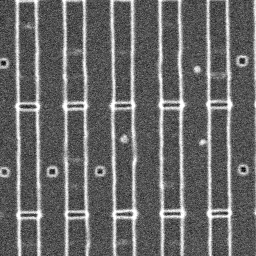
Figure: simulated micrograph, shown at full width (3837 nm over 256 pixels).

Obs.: wiring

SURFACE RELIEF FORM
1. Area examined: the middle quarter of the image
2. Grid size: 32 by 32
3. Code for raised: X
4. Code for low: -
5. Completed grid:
-----XXXXXXX-----XXXXXXX-----XXX
-----XXXXXXX-----XXXXXXX-----XXX
-----XXXXXXX-----XXXXXXX-----XXX
-----XXXXXXXX----XXXXXXX-----XXX
-----XXXXXXXX----XXXXXXX-----XXX
-----XXXXXXXX----XXXXXXX-----XXX
-----XXXXXXXX----XXXXXXX-----XXX
-----XXXXXXXX----XXXXXXX-----XXX
-----XXXXXXXX----XXXXXXX-----XXX
-----XXXXXXXX----XXXXXXX-----XXX
-----XXXXXXX-----XXXXXXX-----XXX
X----XXXXXXX-----XXXXXXX-----XXX
X----XXXXXXX-----XXXXXXX-----XXX
X----XXXXXXX-----XXXXXXX-----XXX
X----XXXXXXX-----XXXXXXX-----XXX
X----XXXXXXX-----XXXXXXX-----XXX
X----XXXXXXX-----XXXXXXX-----XXX
X----XXXXXXX-----XXXXXXX-----XXX
X----XXXXXXX-----XXXXXXX-----XXX
X----XXXXXXX-----XXXXXXX-----XXX
X----XXXXXXXX----XXXXXXX-----XXX
X----XXXXXXXX-----XXXXXX-----XXX
X----XXXXXXXX-----XXXXXX-----XXX
X----XXXXXXXX-----XXXXXX-----XXX
X----XXXXXXXX-----XXXXXX-----XXX
X----XXXXXXXX----XXXXXXX-----XXX
X----XXX--XXX----XXXXXXX-----XXX
X----XXXXXXXX----XXXXXXX-----XXX
X----XXXXXXXX----XXXXXXX-----XXX
X----XXXXXXXX----XXXXXXX-----XXX
X----XXXXXXXX----XXXXXXX-----XXX
X----XXXXXXXX----XXXXXXXX----XXX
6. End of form